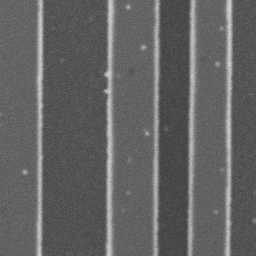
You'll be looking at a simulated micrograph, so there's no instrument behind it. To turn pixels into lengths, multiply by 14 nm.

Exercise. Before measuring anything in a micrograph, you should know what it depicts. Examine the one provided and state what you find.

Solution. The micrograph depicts lines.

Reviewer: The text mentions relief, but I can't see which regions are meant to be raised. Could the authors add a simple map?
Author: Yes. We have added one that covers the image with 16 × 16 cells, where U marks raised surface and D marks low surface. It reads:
UUUDDDDUUUDDUUDD
UUUDDDDUUUDDUUDD
UUUDDDDUUUDDUUDD
UUUDDDDUUUDDUUDD
UUUDDDDUUUDDUUDD
UUDDDDDUUUDDUUDD
UUUDDDDUUUDDUUDD
UUDDDDDUUUDDUUDD
UUDDDDDUUUDDUUDD
UUUDDDDUUUDDUUDD
UUUDDDDUUUDDUUDD
UUDDDDDUUUDDUUDD
UUDDDDDUUUDDUUDD
UUDDDDDUUUDDUUDD
UUDDDDDUUUDDUUDD
UUDDDDDUUUDDUUDD